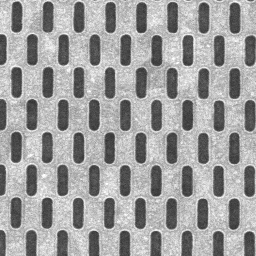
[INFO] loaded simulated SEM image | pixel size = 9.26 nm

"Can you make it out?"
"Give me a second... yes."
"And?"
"a regular array of holes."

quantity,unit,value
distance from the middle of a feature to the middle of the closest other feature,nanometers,287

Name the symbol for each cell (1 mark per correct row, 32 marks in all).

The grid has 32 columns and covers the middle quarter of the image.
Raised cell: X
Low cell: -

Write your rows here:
XXXXXXXXXXXXXXX-XXXXXXX-XXXXXX--
XXX--XXXXX---XXXXX---XXXXX--XXXX
XX---XXXXX---XXXXX---XXXXX---XXX
XX---XXXXX---XXXXX---XXXXX---XXX
XX---XXXXX---XXXXX---XXXXX---XXX
XX---XXXXX---XXXXX---XXXXX---XXX
XX---XXXXX---XXXXX---XXXXX---XXX
XX---XXXXX---XXXXX---XXXXX---XXX
XXX-XXXXXXX-XXXXXXX-XXXXXX--XXXX
-XXXXX---XXXXX---XXXXX--XXXXXX--
-XXXXX---XXXXX---XXXXX---XXXX---
-XXXXX---XXXXX---XXXXX---XXXX---
-XXXXX---XXXXX---XXXXX---XXXX---
-XXXXX---XXXXX---XXXXX---XXXX---
-XXXXX---XXXXX---XXXXX---XXXX---
-XXXXX---XXXXX---XXXXX---XXXX---
XXXXXXX-XXXXXX--XXXXXX--XXXXXX--
XXX--XXXXX--XXXXXX--XXXXXX--XXXX
XX---XXXXX---XXXXX---XXXXX---XXX
XX---XXXXX---XXXXX---XXXXX---XXX
XX---XXXXX---XXXXX---XXXXX---XXX
XX---XXXXX---XXXXX---XXXXX---XXX
XX---XXXXX---XXXXX---XXXXX---XXX
XX---XXXXX---XXXXX---XXXXX---XXX
XXX--XXXXX--XXXXXX--XXXXXX--XXXX
-XXXXXX--XXXXX--XXXXXX--XXXXXX-X
-XXXXX---XXXXX---XXXXX--XXXXX---
-XXXXX---XXXXX---XXXX----XXXX---
-XXXXX---XXXXX---XXXX----XXXX---
-XXXXX---XXXXX---XXXX----XXXX---
-XXXXX---XXXXX---XXXX----XXXX---
-XXXXX---XXXXX---XXXX----XXXX---